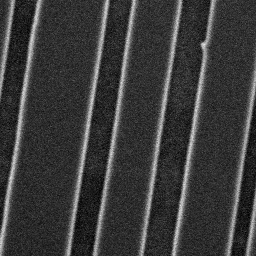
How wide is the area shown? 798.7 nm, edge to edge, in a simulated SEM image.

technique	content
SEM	one or a few lines or trenches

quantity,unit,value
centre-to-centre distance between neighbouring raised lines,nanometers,259